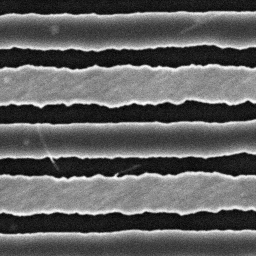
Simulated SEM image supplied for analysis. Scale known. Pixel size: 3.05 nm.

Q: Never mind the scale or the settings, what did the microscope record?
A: lines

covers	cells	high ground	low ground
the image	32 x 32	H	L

LLLLLLLLLLLLLLLLLLLLLLLLLLLLLLLL
LLLLLLLLLLLLLLLLLLLLLLHHLLHHHHHH
HHHHHHHHHHHHHHHHHHHHHHHHHHHHHHHH
HHHHHHHHHHHHHHHHHHHHHHHHHHHHHHHH
HHHHHHHHHHHHHHHHHHHHHHHHHHHHHHHH
HHHHHHHHHHHHHHHHHHHHHHHHHHHHHHHH
LLLLLLLLLLLLLLLLLLLLLLLLLLLLLLLL
LLLLLLLLLLLLLLLLLLLLLLLLLLLLLLLL
LLHHHHHLLLLHHLHHHHHHHLHHHHHHHHHL
HHHHHHHHHHHHHHHHHHHHHHHHHHHHHHHH
HHHHHHHHHHHHHHHHHHHHHHHHHHHHHHHH
HHHHHHHHHHHHHHHHHHHHHHHHHHHHHHHH
HHHHHHHHHHHHHHHHHHHHHHHHHHHHHHHH
LLLLLLLLLLLLLLLLLLLLLLLLLLLLLLLL
LLLLLLLLLLLLLLLLLLLLLLLLLLLLLLLL
LHHHHHLLLHHHHHHHHHHHHHHHHHHHHHHH
HHHHHHHHHHHHHHHHHHHHHHHHHHHHHHHH
HHHHHHHHHHHHHHHHHHHHHHHHHHHHHHHH
HHHHHHHHHHHHHHHHHHHHHHHHHHHHHHHH
HHHHHHHHHHHHHHHHHHHHHHHHHHHLLLLL
LLLLLLLLLLLLLLLLLLLLLLLLLLLLLLLL
LLLLLLLLLLLLLLLLLLLLLLLLLLLLLLLL
HHHHHHHHHHHHHHHHHHHHHHHHHHHHHHHH
HHHHHHHHHHHHHHHHHHHHHHHHHHHHHHHH
HHHHHHHHHHHHHHHHHHHHHHHHHHHHHHHH
HHHHHHHHHHHHHHHHHHHHHHHHHHHHHHHH
HHHHHHHHHHHHHHLHHHLHHHHHHLHLLLLL
LLLLLLLLLLLLLLLLLLLLLLLLLLLLLLLL
LLLLLLLLLLLLLLLLLLLLLLLLLLLLLLLL
HHHHHHHHHHHHHHHHHHHHHHHHHHHHHHHH
HHHHHHHHHHHHHHHHHHHHHHHHHHHHHHHH
HHHHHHHHHHHHHHHHHHHHHHHHHHHHHHHH